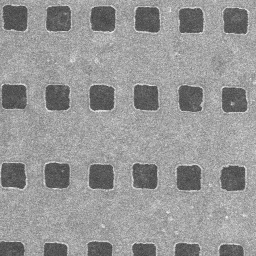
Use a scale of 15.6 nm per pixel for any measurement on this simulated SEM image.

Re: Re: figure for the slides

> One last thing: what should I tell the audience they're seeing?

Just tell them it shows a regular array of holes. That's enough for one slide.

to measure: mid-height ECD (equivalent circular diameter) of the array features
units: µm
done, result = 0.433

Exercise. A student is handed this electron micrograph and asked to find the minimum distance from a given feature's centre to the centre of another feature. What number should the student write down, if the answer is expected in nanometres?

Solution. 680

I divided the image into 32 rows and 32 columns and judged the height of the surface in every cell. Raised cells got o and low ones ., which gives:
oooooooooooooooooooooooooooooooo
...ooo...oo...ooo...oo...ooo...o
...ooo...oo....oo...oo...ooo...o
o..ooo...oo...ooo...oo...ooo...o
oooooooooooooooooooooooooooooooo
oooooooooooooooooooooooooooooooo
oooooooooooooooooooooooooooooooo
oooooooooooooooooooooooooooooooo
oooooooooooooooooooooooooooooooo
oooooooooooooooooooooooooooooooo
oooooooooooooooooooooooooooooooo
...ooo...oo...ooo...oo...ooo...o
...ooo...oo...ooo...oo...ooo...o
o..ooo..ooo...ooo...oo...ooo...o
oooooooooooooooooooooooooooooooo
oooooooooooooooooooooooooooooooo
oooooooooooooooooooooooooooooooo
oooooooooooooooooooooooooooooooo
oooooooooooooooooooooooooooooooo
oooooooooooooooooooooooooooooooo
...ooo..oooo.oooo.oooooooooooooo
...ooo...oo...ooo...oo...ooo...o
...oo....oo...ooo...oo...oo....o
o..ooo..ooo...ooo..ooo...ooo...o
oooooooooooooooooooooooooooooooo
oooooooooooooooooooooooooooooooo
oooooooooooooooooooooooooooooooo
oooooooooooooooooooooooooooooooo
oooooooooooooooooooooooooooooooo
oooooooooooooooooooooooooooooooo
...ooo..ooo...ooo..ooo..oooo.ooo
...oo....oo...ooo...oo...oo....o